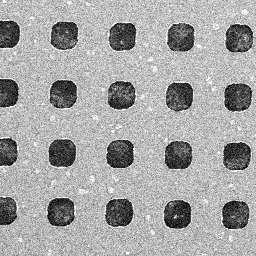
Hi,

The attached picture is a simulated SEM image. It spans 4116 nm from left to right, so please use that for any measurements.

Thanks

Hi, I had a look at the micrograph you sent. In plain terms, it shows a regular array of holes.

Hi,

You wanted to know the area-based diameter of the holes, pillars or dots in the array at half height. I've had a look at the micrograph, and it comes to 480 nanometres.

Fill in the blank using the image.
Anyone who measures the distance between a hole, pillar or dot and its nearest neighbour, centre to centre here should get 934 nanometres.